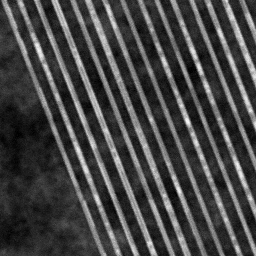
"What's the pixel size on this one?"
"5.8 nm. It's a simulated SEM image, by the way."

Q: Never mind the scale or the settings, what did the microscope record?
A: parallel lines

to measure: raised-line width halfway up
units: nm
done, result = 21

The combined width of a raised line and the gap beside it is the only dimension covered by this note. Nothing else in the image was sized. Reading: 91.8 nanometers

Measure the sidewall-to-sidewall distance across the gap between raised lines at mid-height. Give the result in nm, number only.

67.5